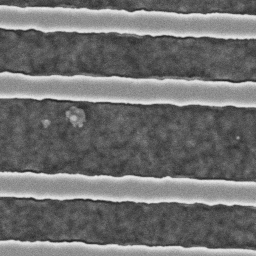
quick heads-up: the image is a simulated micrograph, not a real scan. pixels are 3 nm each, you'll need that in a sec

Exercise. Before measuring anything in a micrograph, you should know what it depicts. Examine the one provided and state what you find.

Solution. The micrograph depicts lines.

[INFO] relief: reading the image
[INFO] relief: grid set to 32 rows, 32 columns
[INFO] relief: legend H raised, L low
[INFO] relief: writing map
LLLLLLLLLLLLLLLLLLLLLLLLLLLLLLLL
HHHHHHHHHHHHHHHHHHHHLLLLLLLLLLLL
HHHHHHHHHHHHHHHHHHHHHHHHHHHHHHHH
HHHHHHHHHHHHHHHHHHHHHHHHHHHHHHHH
LLLLLLLLLLLLLLLLLLLHLHHHHHHHHHHH
LLLLLLLLLLLLLLLLLLLLLLLLLLLLLLLL
LLLLLLLLLLLLLLLLLLLLLLLLLLLLLLLL
LLLLLLLLLLLLLLLLLLLLLLLLLLLLLLLL
LLLLLLLLLLLLLLLLLLLLLLLLLLLLLLLL
HHHHLLHHLHHLLLLLLLLLLLLLLLLLLLLL
HHHHHHHHHHHHHHHHHHHHHHHHHHHHHHHH
HHHHHHHHHHHHHHHHHHHHHHHHHHHHHHHH
LLLLLLLLLHHHHHHHHHHHHHHHHHHHHHHH
LLLLLLLLLLLLLLLLLLLLLLLLLLLLLLLL
LLLLLLLLLHLLLLLLLLLLLLLLLLLLLLLL
LLLLLLLLLLLLLLLLLLLLLLLLLLLLLLLL
LLLLLLLLLLLLLLLLLLLLLLLLLLLLLLLL
LLLLLLLLLLLLLLLLLLLLLLLLLLLLLLLL
LLLLLLLLLLLLLLLLLLLLLLLLLLLLLLLL
LLLLLLLLLLLLLLLLLLLLLLLLLLLLLLLL
LLLLLLLLLLLLLLLLLLLLLLLLLLLLLLLL
LLLLLLLLLLLLLLLLLLLLLLLLLLLLLLLL
HHHHHHHHHHHHHHHHHHHHHHHHHLLLLLLL
HHHHHHHHHHHHHHHHHHHHHHHHHHHHHHHH
HHHHHHHHHHHHHHHHHHHHHHHHHHHHHHHH
LLLLLLLLLLLLLLLLLLLLLLLLLLHHHHHH
LLLLLLLLLLLLLLLLLLLLLLLLLLLLLLLL
LLLLLLLLLLLLLLLLLLLLLLLLLLLLLLLL
LLLLLLLLLLLLLLLLLLLLLLLLLLLLLLLL
LLLLLLLLLLLLLLLLLLLLLLLLLLLLLLLL
HHHHHHHHHHHLLLLLLLLLLLLLLLLLLLLL
HHHHHHHHHHHHHHHHHHHHHHHHHHHHHHHH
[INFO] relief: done